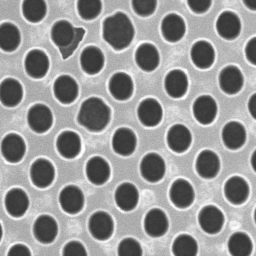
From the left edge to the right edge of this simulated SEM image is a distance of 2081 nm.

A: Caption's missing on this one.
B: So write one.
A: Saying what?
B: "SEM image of a regular array of holes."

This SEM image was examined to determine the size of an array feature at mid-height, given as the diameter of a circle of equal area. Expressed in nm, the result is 210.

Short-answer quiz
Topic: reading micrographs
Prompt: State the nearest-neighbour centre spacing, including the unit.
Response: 315 nm